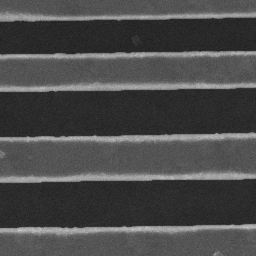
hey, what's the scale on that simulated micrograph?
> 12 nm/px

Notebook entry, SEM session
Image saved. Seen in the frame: lines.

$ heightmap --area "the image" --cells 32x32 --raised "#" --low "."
################################
################################
###########.....................
................................
................................
................................
.........................##.####
################################
################################
################################
################################
................................
................................
................................
................................
................................
................................
################################
################################
################################
################################
################################
############.###................
................................
................................
................................
................................
................................
...........#####################
################################
################################
################################